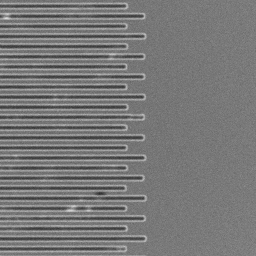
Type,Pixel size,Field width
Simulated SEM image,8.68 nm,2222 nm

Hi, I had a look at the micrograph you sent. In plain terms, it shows parallel lines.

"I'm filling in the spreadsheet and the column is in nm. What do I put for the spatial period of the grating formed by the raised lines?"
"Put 87.9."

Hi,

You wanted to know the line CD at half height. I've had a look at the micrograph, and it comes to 51 nm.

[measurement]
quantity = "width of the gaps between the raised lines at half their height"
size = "39.1 nanometres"